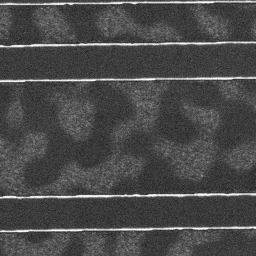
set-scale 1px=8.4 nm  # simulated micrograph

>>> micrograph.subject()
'lines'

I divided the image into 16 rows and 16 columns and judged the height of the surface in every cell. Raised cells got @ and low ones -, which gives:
----------------
----------------
----------------
@@@@@@@@@@@@@@@@
@@@@@@@@@@@@@@@@
----------------
----------------
----------------
----------------
----------------
----------------
----------------
@@@@@@@@@@@@@@@@
@@@@@@@@@@@@@@@@
----------------
----------------